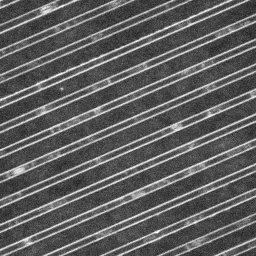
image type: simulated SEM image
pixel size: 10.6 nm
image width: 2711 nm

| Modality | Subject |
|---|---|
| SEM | parallel lines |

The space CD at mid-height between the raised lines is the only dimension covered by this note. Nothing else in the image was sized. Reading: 168 nm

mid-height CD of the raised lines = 75.3 nanometres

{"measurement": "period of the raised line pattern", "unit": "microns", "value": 0.242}